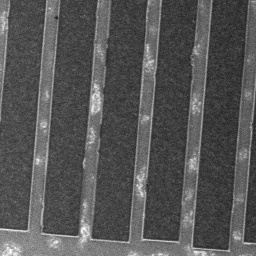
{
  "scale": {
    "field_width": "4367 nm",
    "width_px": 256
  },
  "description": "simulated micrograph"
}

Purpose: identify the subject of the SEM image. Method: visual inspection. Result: parallel lines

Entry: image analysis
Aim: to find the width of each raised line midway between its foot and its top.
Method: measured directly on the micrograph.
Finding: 644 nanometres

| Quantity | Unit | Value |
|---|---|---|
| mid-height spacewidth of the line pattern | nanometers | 215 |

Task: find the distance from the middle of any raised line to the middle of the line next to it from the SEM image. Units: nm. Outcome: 858